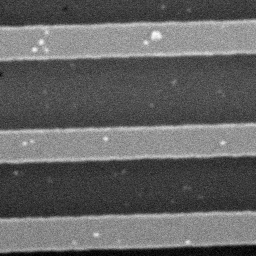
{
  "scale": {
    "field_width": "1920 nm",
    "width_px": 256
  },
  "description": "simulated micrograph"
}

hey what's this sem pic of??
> lines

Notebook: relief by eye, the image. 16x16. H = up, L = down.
LLLLLLLLLLLLLLLL
LLLLLLLLHHHHHHHH
HHHHHHHHHHHHHHHH
HHHHHHHHHLLLLLLL
LLLLLLLLLLLLLLLL
LLLLLLLLLLLLLLLL
LLLLLLLLLLLLLLLL
LLLLLLLLLLLLLLLL
HHHHHHHHHHHHHHHH
HHHHHHHHHHHHHHHH
LLLLLLLLLLLLLLLL
LLLLLLLLLLLLLLLL
LLLLLLLLLLLLLLLL
LLLLLLHHHHHHHHHH
HHHHHHHHHHHHHHHH
HHHHHHHHHLLLLLLL